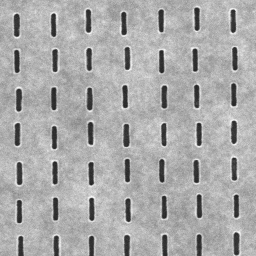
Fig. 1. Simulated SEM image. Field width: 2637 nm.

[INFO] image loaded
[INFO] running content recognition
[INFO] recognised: a regular array of holes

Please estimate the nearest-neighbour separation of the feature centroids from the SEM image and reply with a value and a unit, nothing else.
0.362 microns